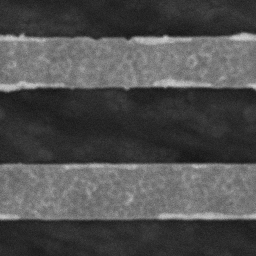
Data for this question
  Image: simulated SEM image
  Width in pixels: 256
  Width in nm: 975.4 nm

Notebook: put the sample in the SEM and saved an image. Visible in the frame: one or a few lines or trenches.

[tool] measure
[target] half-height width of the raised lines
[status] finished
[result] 207 nm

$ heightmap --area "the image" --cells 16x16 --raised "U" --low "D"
DDDDDDDDDDDDDDDD
DDDDDDDDDDDDDDDD
UUUUUUUUUUUUUUUU
UUUUUUUUUUUUUUUU
UUUUUUUUUUUUUUUU
UUDDDDDDDDDDDDDD
DDDDDDDDDDDDDDDD
DDDDDDDDDDDDDDDD
DDDDDDDDDDDDDDDD
DDDDDDDDDDDDDDDD
UUUUUUUUUUUUUUUU
UUUUUUUUUUUUUUUU
UUUUUUUUUUUUUUUU
UUUUUUUUUUUUUUUU
DDDDDDDDDDDDDDDD
DDDDDDDDDDDDDDDD